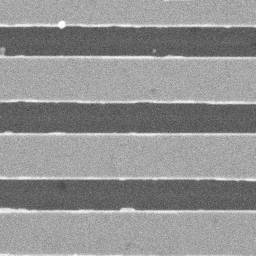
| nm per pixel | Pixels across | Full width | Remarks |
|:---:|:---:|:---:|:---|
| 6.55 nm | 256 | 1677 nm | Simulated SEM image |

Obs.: lines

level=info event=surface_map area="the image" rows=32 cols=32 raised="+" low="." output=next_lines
++++++++++++++++++++++++++++++++
++++++++++++++++++++++++++++++++
++++++++++++++++++++++++++++++++
................................
................................
................................
................................
++++++++++++++++++++++++++++++++
++++++++++++++++++++++++++++++++
++++++++++++++++++++++++++++++++
++++++++++++++++++++++++++++++++
++++++++++++++++++++++++++++++++
++++++++++++++++++++++++++++++++
................................
................................
................................
................................
++++++++++++++++++++++++++++++++
++++++++++++++++++++++++++++++++
++++++++++++++++++++++++++++++++
++++++++++++++++++++++++++++++++
++++++++++++++++++++++++++++++++
.............................+++
................................
................................
................................
++++++++++++++++++++++++++++++++
++++++++++++++++++++++++++++++++
++++++++++++++++++++++++++++++++
++++++++++++++++++++++++++++++++
++++++++++++++++++++++++++++++++
++++++++++++++++++++++++++++++++